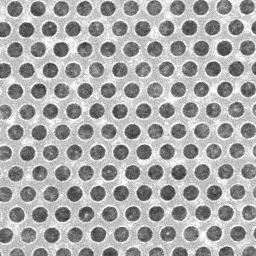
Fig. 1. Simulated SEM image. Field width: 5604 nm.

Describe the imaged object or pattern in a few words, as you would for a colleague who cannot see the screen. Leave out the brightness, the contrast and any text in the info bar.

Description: a regular array of holes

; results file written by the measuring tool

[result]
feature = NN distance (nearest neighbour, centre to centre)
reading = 505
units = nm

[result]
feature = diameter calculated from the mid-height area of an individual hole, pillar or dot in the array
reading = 353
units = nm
